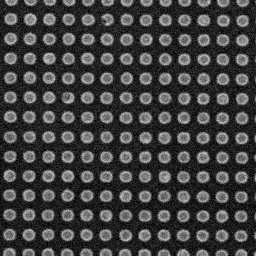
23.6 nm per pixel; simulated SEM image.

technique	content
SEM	a regular array of raised bodies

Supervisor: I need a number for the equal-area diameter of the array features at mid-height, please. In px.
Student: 11.2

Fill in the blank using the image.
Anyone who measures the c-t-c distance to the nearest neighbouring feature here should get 451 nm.